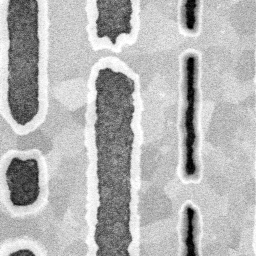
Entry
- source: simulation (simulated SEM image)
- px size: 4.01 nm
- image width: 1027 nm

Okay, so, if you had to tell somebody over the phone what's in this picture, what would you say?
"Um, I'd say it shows one or a few lines or trenches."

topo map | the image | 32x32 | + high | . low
.....++++++......++++++..+++++++
.....++++++......++++++..+++++++
.....+++++++.....++++++..+++++++
.....++++++......++++++..+++++++
.....++++++......+++++++++++++++
+.....++++++...+++++++++++++++++
+....+++++++++++++++++++++++++++
.....++++++++++++++++++..+++++++
.....+++++++...++++++++..+++++++
.....+++++++....+++++++..+++++++
.....++++++......++++++..+++++++
.....++++++......++++++..+++++++
.....++++++......++++++..+++++++
.....++++++......++++++..+++++++
+....++++++......++++++..+++++++
++..+++++++......++++++..+++++++
+++++++++++......++++++..+++++++
+++++++++++......++++++..+++++++
+++++++++++......++++++..+++++++
+....+++++++.....++++++..+++++++
+....+++++++.....++++++..+++++++
.....++++++......++++++..+++++++
.....++++++......+++++++++++++++
+.....++++++.....+++++++++++++++
+....+++++++.....+++++++++++++++
+....+++++++.....+++++++++++++++
++++++++++++.....++++++..+++++++
+++++++++++......++++++..+++++++
++++++++++++.....++++++..+++++++
+++++++++++......++++++..+++++++
+++++++++++......++++++..+++++++
+....+++++++.....++++++..+++++++